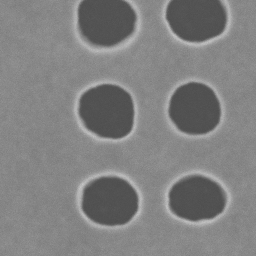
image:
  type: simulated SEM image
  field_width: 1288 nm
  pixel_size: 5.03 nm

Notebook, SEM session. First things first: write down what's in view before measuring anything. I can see holes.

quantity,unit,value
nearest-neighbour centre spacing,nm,438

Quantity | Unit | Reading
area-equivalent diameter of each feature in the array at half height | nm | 267